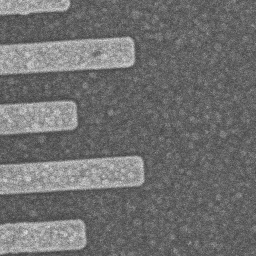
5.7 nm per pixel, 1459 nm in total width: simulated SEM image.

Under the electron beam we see parallel lines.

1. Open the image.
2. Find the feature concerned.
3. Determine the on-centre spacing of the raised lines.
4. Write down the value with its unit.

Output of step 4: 59.6 pixels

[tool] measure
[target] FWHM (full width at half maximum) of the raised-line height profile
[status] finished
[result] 167 nm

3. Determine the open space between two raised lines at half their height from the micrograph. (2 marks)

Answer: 178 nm